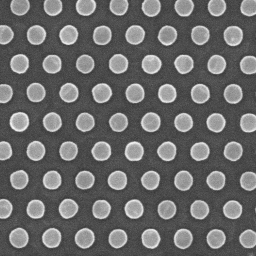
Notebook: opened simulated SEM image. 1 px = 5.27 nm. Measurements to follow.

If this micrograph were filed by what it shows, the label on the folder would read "a regular array of raised bodies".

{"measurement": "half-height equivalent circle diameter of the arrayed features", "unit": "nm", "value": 97.7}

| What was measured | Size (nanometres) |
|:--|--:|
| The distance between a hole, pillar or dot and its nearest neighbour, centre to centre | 172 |